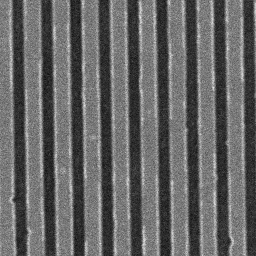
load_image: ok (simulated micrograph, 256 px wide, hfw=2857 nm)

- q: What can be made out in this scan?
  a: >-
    parallel lines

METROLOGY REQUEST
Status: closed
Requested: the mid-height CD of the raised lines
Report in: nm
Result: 181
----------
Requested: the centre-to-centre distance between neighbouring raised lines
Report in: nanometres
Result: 322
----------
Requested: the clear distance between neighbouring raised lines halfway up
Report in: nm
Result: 141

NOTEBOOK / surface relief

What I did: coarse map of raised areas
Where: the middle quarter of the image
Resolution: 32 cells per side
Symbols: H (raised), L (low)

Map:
HLLLLHHHHLLLHHHHLLLHHHHLLLHHHHLL
HLLLLHHHHLLLHHHHLLLHHHHLLLHHHHLL
HLLLLHHHHLLLHHHHLLLHHHHLLLHHHHLL
HLLLLHHHHLLLHHHHLLLHHHHLLLHHHHLL
HLLLLHHHHLLLHHHHLLLHHHHLLLHHHHLL
HLLLLHHHHLLLHHHHLLLHHHHLLLHHHHLL
HLLLLHHHHLLLHHHHLLLHHHHLLLHHHHLL
HLLLLHHHHLLLHHHHLLLHHHHLLLHHHHLL
HLLLLHHHHLLLHHHHLLLHHHHLLLHHHHLL
HLLLLHHHHLLLHHHHLLLHHHHLLLHHHHLL
HLLLLHHHHLLLHHHHLLLHHHHLLLLHHHLL
HLLLLHHHHLLLHHHHLLLHHHHLLLLHHHLL
HHLLLHHHHLLLHHHHLLLHHHHLLLLHHHLL
HHLLLHHHHLLLHHHHLLLHHHHLLLLHHHLL
HHLLLHHHHLLLHHHHLLLHHHHLLLLHHHLL
HHLLLHHHHLLLHHHHLLLHHHHLLLLHHHLL
HHLLLHHHHLLLHHHHLLLHHHHLLLLHHHHL
HHLLLHHHHLLLHHHHLLLHHHHLLLLHHHLL
HHLLLHHHHLLLHHHHLLLHHHHLLLLHHHLL
HHLLLHHHHLLLHHHHLLLHHHHLLLLHHHLL
HHLLLHHHHLLLHHHHLLLHHHHLLLLHHHLL
HHLLLHHHHLLLHHHHLLLHHHHLLLLHHHLL
HHLLLHHHHLLLHHHHLLLHHHHLLLLHHHHL
HHLLLHHHHLLLHHHHLLLHHHHLLLLHHHHL
HHLLLHHHHLLLHHHHLLLLHHHLLLLHHHHL
HHLLLHHHHLLLHHHHLLLLHHHLLLLHHHHL
HHLLLHHHHLLLHHHHLLLLHHHLLLLHHHHL
HHLLLHHHHLLLHHHHLLLLHHHLLLLHHHHL
HHLLLHHHHLLLHHHHLLLLHHHLLLLHHHHL
HHLLLHHHHLLLHHHHLLLLHHHLLLLHHHHL
HHLLLHHHHLLLHHHHLLLLHHHLLLLHHHHL
HHLLLHHHHLLLHHHHLLLLHHHLLLLHHHHL